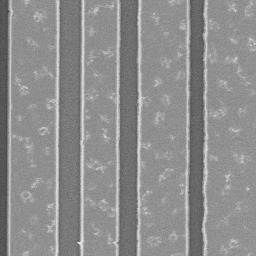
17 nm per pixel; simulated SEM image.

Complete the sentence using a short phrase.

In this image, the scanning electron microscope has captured one or a few lines or trenches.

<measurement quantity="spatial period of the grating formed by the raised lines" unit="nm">1100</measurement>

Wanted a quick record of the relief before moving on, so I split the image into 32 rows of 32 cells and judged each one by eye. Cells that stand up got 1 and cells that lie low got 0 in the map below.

01111110001111100011111000111111
01111110001111100011111000111111
01111110001111100011111000111111
01111110001111100011111100111111
01111110001111100111111100111111
01111110001111100111111000111111
01111110001111100111111000111111
01111110001111100111111000111111
01111110001111100111111000111111
01111110001111100111111000111111
01111110001111100111111000111111
01111110001111100111111000111111
01111110001111100011111000111111
01111110001111100011111000111111
01111110001111100111111000111111
01111110001111100111111000111111
01111110001111100111111000111111
01111110001111100111111000111111
01111110001111100111111000111111
01111110001111100111111000111111
01111110001111100111111000111111
01111110001111100111111000111111
01111110001111100111111000111111
01111110001111100111111000111111
01111110001111100111111000111111
01111110001111100111111000111111
01111110001111100111111000111111
01111110001111100111111000111111
01111110001111100111111000111111
01111110001111100111111000111111
01111110001111100111111000111111
01111110001111100111111000111111